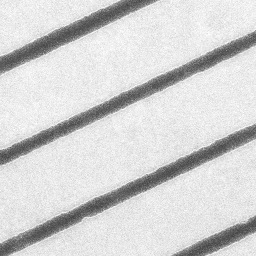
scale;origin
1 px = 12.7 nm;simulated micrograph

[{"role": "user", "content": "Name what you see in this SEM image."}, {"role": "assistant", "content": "one or a few lines or trenches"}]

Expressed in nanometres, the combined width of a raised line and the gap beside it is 1070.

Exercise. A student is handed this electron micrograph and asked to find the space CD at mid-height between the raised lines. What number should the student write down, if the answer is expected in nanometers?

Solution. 857